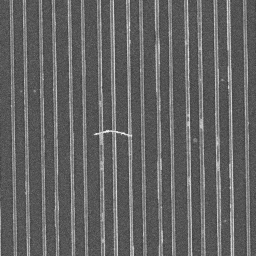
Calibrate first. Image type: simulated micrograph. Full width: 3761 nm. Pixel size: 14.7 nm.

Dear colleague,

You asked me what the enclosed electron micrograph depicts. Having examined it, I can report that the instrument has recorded parallel lines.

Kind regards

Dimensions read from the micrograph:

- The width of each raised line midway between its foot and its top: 0.0422 um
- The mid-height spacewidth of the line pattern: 182 nanometers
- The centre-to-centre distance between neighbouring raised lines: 214 nm